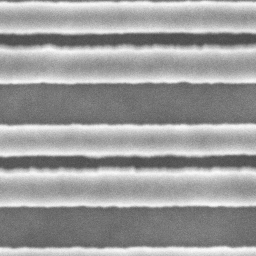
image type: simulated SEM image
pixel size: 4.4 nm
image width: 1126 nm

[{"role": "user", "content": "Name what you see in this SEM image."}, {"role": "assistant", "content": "lines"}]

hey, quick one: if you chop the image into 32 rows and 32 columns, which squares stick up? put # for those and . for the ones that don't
#.#######..########.############
################################
################################
################################
................................
................................
################################
################################
################################
################################
................................
................................
................................
................................
................................
................................
################################
################################
################################
##.........###...##.............
................................
################################
################################
################################
################################
################################
................................
................................
................................
................................
................................
################################